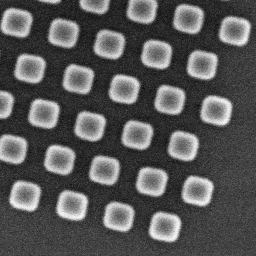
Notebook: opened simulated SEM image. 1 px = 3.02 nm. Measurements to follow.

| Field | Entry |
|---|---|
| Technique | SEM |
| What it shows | a regular array of raised bodies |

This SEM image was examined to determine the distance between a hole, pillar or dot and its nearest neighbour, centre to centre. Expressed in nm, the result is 142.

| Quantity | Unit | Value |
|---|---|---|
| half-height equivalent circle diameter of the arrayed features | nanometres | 85.5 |